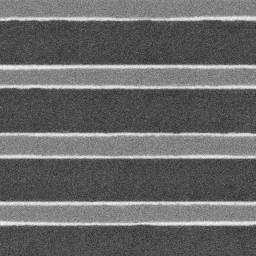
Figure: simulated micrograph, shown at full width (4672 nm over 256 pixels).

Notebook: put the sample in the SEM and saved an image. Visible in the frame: lines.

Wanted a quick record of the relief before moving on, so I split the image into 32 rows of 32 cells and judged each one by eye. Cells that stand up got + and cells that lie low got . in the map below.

++++++++++++++++++++++++++++++++
++++++++++++++++++++++++++++++++
................................
................................
................................
................................
................................
................................
++++++++++++++++++++++++++++++++
++++++++++++++++++++++++++++++++
++++++++++++++++++++++++++++++++
................................
................................
................................
................................
................................
................................
++++++++++++++++++++++++++++++++
++++++++++++++++++++++++++++++++
++++++++++++++++++++++++++++++++
................................
................................
................................
................................
................................
++++++++++++++++++++++++++++++++
++++++++++++++++++++++++++++++++
++++++++++++++++++++++++++++++++
................................
................................
................................
................................